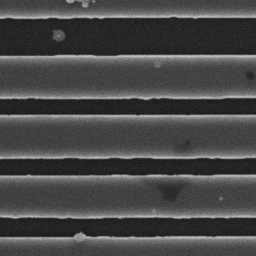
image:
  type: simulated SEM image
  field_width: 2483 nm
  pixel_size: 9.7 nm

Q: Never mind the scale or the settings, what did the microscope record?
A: lines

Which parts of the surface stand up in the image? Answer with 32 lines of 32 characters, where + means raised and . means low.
++++++++++++++++++++++++++++++++
++++++++++++++++++++++++++++++++
................................
................................
................................
................................
................................
++++++++++++++++++++++++++++++++
++++++++++++++++++++++++++++++++
++++++++++++++++++++++++++++++++
++++++++++++++++++++++++++++++++
++++++++++++++++++++++++++++++++
................................
................................
++++++++++++++++++++++++++++++++
++++++++++++++++++++++++++++++++
++++++++++++++++++++++++++++++++
++++++++++++++++++++++++++++++++
++++++++++++++++++++++++++++++++
++++++++++++++++++++++++++++++++
................................
................................
++++++++++++++++++++++++++++++++
++++++++++++++++++++++++++++++++
++++++++++++++++++++++++++++++++
++++++++++++++++++++++++++++++++
++++++++++++++++++++++++++++++++
................................
................................
.........++.....................
++++++++++++++++++++++++++++++++
++++++++++++++++++++++++++++++++